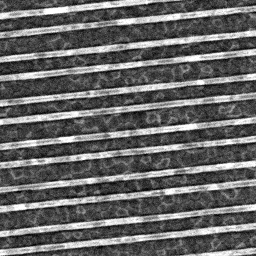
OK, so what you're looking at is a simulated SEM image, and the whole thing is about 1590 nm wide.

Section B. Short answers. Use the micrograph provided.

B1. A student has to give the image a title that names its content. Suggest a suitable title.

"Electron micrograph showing parallel lines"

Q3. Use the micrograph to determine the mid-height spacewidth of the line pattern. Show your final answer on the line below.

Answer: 94.2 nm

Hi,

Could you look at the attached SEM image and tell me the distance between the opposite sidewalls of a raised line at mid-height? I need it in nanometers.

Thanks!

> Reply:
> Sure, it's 29.3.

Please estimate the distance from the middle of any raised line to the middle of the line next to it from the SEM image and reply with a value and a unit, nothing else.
21.6 pixels